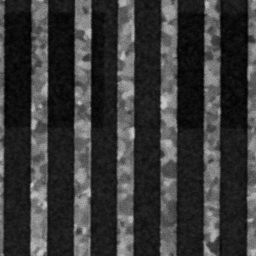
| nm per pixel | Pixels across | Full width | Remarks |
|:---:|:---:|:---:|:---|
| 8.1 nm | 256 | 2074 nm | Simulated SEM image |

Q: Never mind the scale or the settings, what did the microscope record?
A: parallel lines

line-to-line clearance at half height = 229 nanometers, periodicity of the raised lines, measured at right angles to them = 350 nanometers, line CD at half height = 122 nanometers